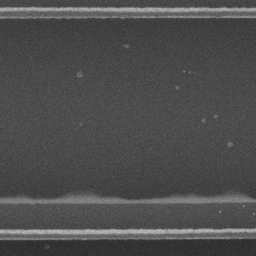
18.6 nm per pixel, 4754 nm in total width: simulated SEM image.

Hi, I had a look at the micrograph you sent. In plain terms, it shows lines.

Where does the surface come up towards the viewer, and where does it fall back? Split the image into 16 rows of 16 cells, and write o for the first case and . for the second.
oooooooooooooooo
................
................
................
................
................
................
................
................
................
................
................
................
oooooooooooooooo
oooooooooooooooo
................